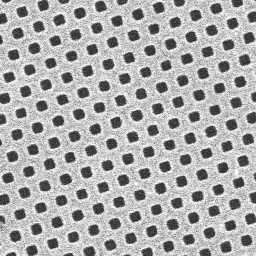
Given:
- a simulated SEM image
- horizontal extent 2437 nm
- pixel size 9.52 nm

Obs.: a regular array of holes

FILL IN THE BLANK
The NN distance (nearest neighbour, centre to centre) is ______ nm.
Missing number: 205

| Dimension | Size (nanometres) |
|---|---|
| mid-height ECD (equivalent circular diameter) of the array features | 114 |